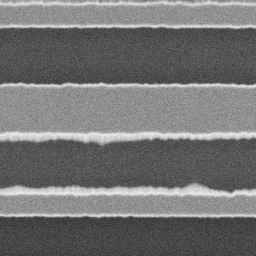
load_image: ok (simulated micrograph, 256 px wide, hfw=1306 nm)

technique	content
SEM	lines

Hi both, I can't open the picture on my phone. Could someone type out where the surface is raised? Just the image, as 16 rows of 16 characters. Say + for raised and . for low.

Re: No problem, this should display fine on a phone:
++++++++++++++++
++++++++++++++++
................
................
................
++++++++++++++++
++++++++++++++++
++++++++++++++++
.....++.........
................
................
................
++++++++++++++++
++++++++++++++++
................
................